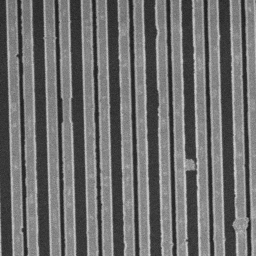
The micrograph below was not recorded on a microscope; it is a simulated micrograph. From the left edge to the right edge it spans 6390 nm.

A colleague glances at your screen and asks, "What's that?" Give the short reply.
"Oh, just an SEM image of parallel lines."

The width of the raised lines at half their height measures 243 nm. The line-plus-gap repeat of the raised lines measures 464 nm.